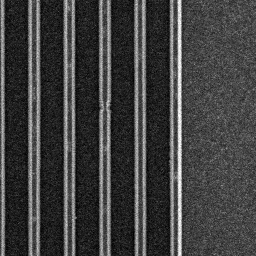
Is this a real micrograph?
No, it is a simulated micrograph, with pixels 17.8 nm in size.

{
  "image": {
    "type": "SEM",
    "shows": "parallel lines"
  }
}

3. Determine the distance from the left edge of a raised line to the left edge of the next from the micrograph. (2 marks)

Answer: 631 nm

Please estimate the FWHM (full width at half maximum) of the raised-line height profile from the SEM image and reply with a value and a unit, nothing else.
158 nm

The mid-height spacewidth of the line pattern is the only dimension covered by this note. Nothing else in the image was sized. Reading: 0.475 micrometres